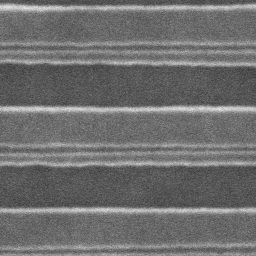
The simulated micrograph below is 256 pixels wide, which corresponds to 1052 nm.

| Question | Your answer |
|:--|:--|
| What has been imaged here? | lines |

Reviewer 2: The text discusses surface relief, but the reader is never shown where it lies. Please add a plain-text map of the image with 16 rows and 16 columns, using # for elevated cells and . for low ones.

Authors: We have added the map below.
################
################
################
################
................
................
................
################
################
################
................
................
................
################
################
################